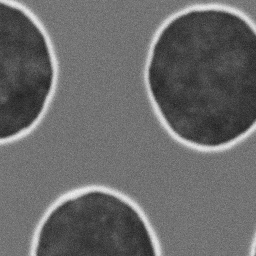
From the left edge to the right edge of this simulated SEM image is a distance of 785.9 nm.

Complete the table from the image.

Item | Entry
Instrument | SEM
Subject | holes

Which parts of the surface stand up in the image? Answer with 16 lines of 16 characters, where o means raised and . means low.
.ooooooooooooooo
..oooooooo......
...ooooooo......
...oooooo.......
...oooooo.......
...oooooo.......
...ooooooo......
..oooooooo......
.oooooooooo....o
oooooooooooooooo
oooooooooooooooo
oooooooooooooooo
oooo....oooooooo
ooo......ooooooo
oo.......ooooooo
oo........oooooo